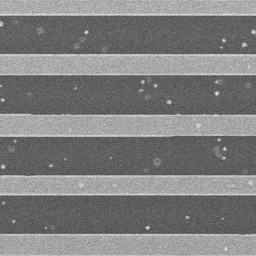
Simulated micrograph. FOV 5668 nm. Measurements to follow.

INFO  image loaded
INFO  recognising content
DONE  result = lines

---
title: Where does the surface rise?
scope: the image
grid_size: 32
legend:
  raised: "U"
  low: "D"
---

UUUUUUUUUUUUUUUUUUUUUUUUUUUUUUUU
UUUUUUUUUUUUUUUUUUUUUUUUUUUUUUUU
DDDDDDDDDDDDDDDDDDDDDDDDDDDDDDDD
DDDDDDDDDDDDDDDDDDDDDDDDDDDDDDDD
DDDDDDDDDDDDDDDDDDDDDDDDDDDDDDDD
DDDDDDDDDDDDDDDDDDDDDDDDDDDDDDDD
DDDDDDDDDDDDDDDDDDDDDDDDDDDDDDDD
UUUUUUUUUUUUUUUUUUUUUUUUUUUUUUUU
UUUUUUUUUUUUUUUUUUUUUUUUUUUUUUUU
DDDDDDDDDDDDDDDDDDDDDDDDDDDDDDDD
DDDDDDDDDDDDDDDDDDDDDDDDDDDDDDDD
DDDDDDDDDDDDDDDDDDDDDDDDDDDDDDDD
DDDDDDDDDDDDDDDDDDDDDDDDDDDDDDDD
DDDDDDDDDDDDDDDDDDDDDDDDDDDDDDDD
UUUUUUUUUUUUUUUUUUUUUUUUUUUUUUUU
UUUUUUUUUUUUUUUUUUUUUUUUUUUUUUUU
UUUUUUUUUUUUUUUUUUUUUUUUUUUUUUUU
DDDDDDDDDDDDDDDDDDDDDDDDDDDDDDDD
DDDDDDDDDDDDDDDDDDDDDDDDDDDDDDDD
DDDDDDDDDDDDDDDDDDDDDDDDDDDDDDDD
DDDDDDDDDDDDDDDDDDDDDDDDDDDDDDDD
DDDDDDDDDDDDDDDDDDDDDDDDDDDDDDDD
UUUUUUUUUUUUUUUUUUUUUUUUUUUUUUUU
UUUUUUUUUUUUUUUUUUUUUUUUUUUUUUUU
DDDDDDDDDDDDDDDDDDDDDDDDDDDDDDDD
DDDDDDDDDDDDDDDDDDDDDDDDDDDDDDDD
DDDDDDDDDDDDDDDDDDDDDDDDDDDDDDDD
DDDDDDDDDDDDDDDDDDDDDDDDDDDDDDDD
DDDDDDDDDDDDDDDDDDDDDDDDDDDDDDDD
UUUUUUUUUUUUUUUUUUUUUUUUUUUUUUUU
UUUUUUUUUUUUUUUUUUUUUUUUUUUUUUUU
UUUUUUUUUUUUUUUUUUUUUUUUUUUUUUUU